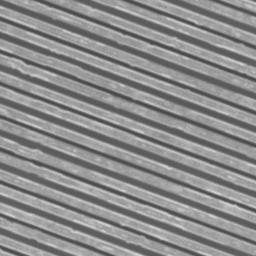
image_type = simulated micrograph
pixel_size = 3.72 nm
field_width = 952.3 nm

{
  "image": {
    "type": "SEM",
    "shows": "parallel lines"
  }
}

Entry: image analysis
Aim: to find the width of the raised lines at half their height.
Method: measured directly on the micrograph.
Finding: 0.0341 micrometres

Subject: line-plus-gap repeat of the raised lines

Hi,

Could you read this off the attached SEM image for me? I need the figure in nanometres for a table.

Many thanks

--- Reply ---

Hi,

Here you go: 57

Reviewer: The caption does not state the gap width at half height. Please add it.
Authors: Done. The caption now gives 23.6 nm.